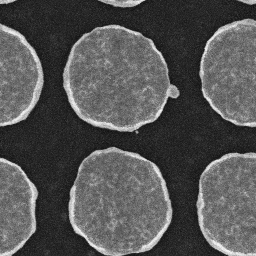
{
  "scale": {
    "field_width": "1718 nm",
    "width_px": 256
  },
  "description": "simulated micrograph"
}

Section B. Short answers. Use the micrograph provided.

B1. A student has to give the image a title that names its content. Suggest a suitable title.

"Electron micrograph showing raised bodies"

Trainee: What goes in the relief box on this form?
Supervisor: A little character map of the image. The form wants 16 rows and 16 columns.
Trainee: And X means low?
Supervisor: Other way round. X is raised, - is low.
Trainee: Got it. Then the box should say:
----------------
---------------X
XX---XXXX----XXX
XX--XXXXXX---XXX
XXX-XXXXXX---XXX
XX--XXXXXXX--XXX
XX---XXXXX---XXX
X----XXXXX----XX
----------------
------XX--------
X----XXXXX---XXX
XX---XXXXX--XXXX
XX--XXXXXXX-XXXX
XX--XXXXXXX--XXX
XX---XXXXX---XXX
X-----XXX-----XX